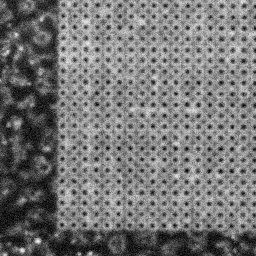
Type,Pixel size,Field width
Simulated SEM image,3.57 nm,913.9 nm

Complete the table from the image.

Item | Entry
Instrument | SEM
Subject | holes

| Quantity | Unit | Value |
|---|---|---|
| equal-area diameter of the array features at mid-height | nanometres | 9.9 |